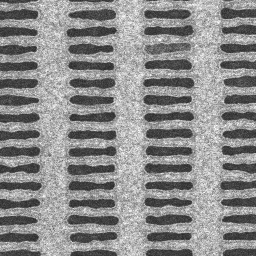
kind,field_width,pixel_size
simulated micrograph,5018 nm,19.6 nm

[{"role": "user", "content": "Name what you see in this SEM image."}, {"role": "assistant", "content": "a regular array of holes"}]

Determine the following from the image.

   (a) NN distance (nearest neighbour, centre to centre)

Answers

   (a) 0.332 um